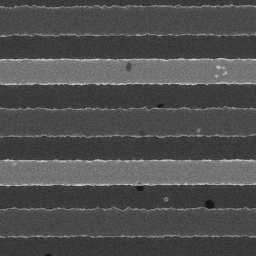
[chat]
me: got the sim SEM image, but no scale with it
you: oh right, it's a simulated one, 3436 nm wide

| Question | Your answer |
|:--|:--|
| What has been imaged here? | lines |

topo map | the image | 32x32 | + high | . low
................................
++++++++++++++++++++++++++++++++
++++++++++++++++++++++++++++++++
++++++++++++++++++++++++++++++++
................................
................................
................................
++++++++++++++++++++++++++++++++
++++++++++++++++++++++++++++++++
++++++++++++++++++++++++++++++++
+++++++++++.++++.+.+.+++++......
................................
................................
............................+...
++++++++++++++++++++++++++++++++
++++++++++++++++++++++++++++++++
++++++++++++++++++++++++++++++++
................................
................................
................................
++++++++++++++++++++++++++++++++
++++++++++++++++++++++++++++++++
++++++++++++++++++++++++++++++++
................................
................................
................................
++++++++++++++++++++++++++++++++
++++++++++++++++++++++++++++++++
++++++++++++++++++++++++++++++++
++++++++++.+++++++++++++++++++++
................................
................................